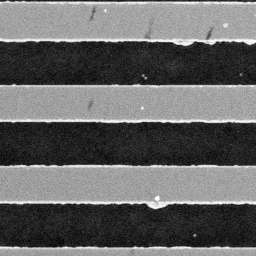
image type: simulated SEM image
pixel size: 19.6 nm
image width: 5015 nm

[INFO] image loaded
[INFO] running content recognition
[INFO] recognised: lines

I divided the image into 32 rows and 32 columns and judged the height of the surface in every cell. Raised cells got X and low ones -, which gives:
XXXXXXXXXXXXXXXXXXXXXXXXXXXXXXXX
XXXXXXXXXXXXXXXXXXXXXXXXXXXXXXXX
XXXXXXXXXXXXXXXXXXXXXXXXXXXXXXXX
XXXXXXXXXXXXXXXXXXXXXXXXXXXXXXXX
XXXXXXXXXXXXXXXXXXXXXXXXXXXXXXXX
----------------------XX--------
--------------------------------
--------------------------------
--------------------------------
--------------------------------
--------------------------------
XXXXXXXXXXXXXXXXXXXXXXXXXXXXXXXX
XXXXXXXXXXXXXXXXXXXXXXXXXXXXXXXX
XXXXXXXXXXXXXXXXXXXXXXXXXXXXXXXX
XXXXXXXXXXXXXXXXXXXXXXXXXXXXXXXX
--------------------------------
--------------------------------
--------------------------------
--------------------------------
--------------------------------
--------------------------------
XXXXXXXXXXXXXXXXXXXXXXXXXXXXXXXX
XXXXXXXXXXXXXXXXXXXXXXXXXXXXXXXX
XXXXXXXXXXXXXXXXXXXXXXXXXXXXXXXX
XXXXXXXXXXXXXXXXXXXXXXXXXXXXXXXX
------------------XXX-----------
--------------------------------
--------------------------------
--------------------------------
--------------------------------
--------------------------------
XXXXXXXXXXXXXXXXXXXXXXXXXXXXXXXX